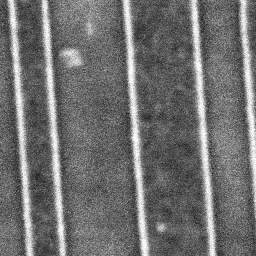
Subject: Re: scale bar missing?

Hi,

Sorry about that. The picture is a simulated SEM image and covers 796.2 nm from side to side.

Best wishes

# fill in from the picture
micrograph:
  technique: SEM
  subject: one or a few lines or trenches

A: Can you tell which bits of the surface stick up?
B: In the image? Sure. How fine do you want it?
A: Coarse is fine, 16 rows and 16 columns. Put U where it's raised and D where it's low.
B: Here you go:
DUUDDDDDUUUUDDDU
DUUDDDDDUUUUDDDU
DUUDDDDDUUUUDDDU
DUUDDDDDUUUUDDDU
DUUDDDDDUUUUDDDU
DUUDDDDDUUUUUDDD
DUUDDDDDUUUUUDDD
DUUDDDDDUUUUUDDD
DUUDDDDDUUUUUDDD
DUUDDDDDDUUUUDDD
DUUUDDDDDUUUUDDD
DDUUDDDDDUUUUDDD
DDUUDDDDDUUUUDDD
DDUUDDDDDUUUUDDD
DDUUDDDDDUUUUDDD
DDUUDDDDDUUUUDDD